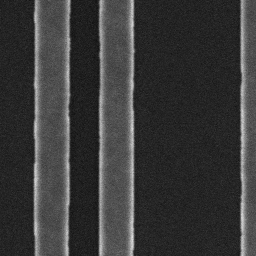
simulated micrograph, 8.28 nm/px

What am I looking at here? lines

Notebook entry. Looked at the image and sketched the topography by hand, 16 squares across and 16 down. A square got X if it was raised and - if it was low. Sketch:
--XX--XX-------X
--XX--XX-------X
--XX--XX-------X
--XX--XX-------X
--XX--XX-------X
--XX--XX-------X
--XX--XX-------X
--XX--XX-------X
--XX--XX-------X
--XX--XX-------X
--XX--XX-------X
--XX--XX-------X
--XX--XX-------X
--XX--XX-------X
--XX--XX-------X
--XX--XX-------X